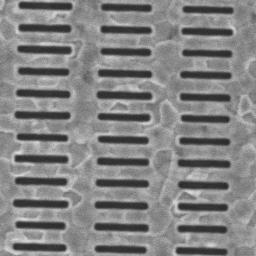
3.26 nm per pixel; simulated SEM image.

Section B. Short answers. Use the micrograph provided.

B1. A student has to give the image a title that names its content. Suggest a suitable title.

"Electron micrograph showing a regular array of holes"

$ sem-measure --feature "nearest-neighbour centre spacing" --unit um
0.0709